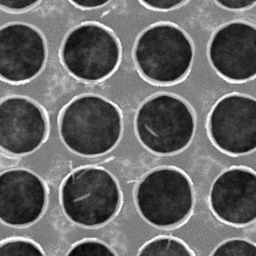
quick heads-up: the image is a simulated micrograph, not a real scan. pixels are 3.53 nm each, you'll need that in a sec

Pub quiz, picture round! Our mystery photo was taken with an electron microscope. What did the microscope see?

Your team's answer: holes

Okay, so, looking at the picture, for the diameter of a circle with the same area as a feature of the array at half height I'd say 206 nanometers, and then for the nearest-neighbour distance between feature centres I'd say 0.253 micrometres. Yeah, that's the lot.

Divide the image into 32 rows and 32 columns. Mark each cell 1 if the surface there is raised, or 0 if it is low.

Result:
00001111110001111100000111100001
11111111111111111111111111111111
11111111111111111111111111111111
00001111110001111110001111110000
00000111100000111100000111100000
00000011000000011000000011000000
00000011000000011000000011000000
00000011000000011000000011000000
00000111000000111000000011100000
00001111110001111100000111110000
11111111111111111111111111111111
11111111111111111111111111111111
10001111100001111110000111110000
00000111000000111100000011100000
00000011000000011000000011000000
00000010000000011000000011000000
00000011000000011000000011000000
00000111000000011100000011100000
00000111100000111110000111110000
11111111111111111111111111111111
11111111111111111111111111111111
10001111100001111110001111110001
00000111000000111100000011100000
00000011000000011000000011100000
00000011000000011000000011000000
00000011000000011000000011000000
00000111000000011100000011100000
00000111100000111100000111110000
11111111111111111111111111111111
11111111111111111111111111111111
00001111110001111110000111110000
00000111100000111100000011100000